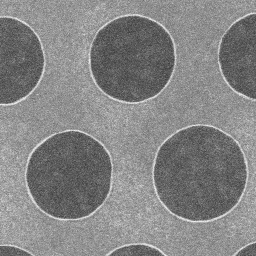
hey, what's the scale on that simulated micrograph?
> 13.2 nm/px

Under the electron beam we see holes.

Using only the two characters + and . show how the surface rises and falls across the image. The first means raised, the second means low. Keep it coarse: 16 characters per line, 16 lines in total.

++++++++++++++++
..+++++...+++++.
..++++.....+++..
...+++.....+++..
...+++.....+++..
..++++....+++++.
++++++++++++++++
++++++++++++++++
+++...+++++...++
++.....+++.....+
++.....+++.....+
++.....+++.....+
++.....+++.....+
+++..++++++...++
++++++++++++++++
.+++++++..+++++.